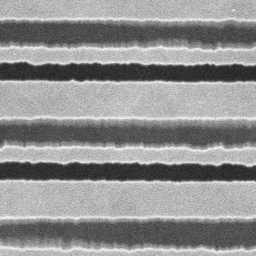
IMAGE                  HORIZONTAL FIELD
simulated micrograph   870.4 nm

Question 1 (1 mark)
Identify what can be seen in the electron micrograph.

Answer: lines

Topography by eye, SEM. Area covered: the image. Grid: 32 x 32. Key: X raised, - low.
XXXXXXXXXXXXXXXXXXXXXXXXXXXXXXXX
XXXXXXXXXXXXXXXXXXXXXXXXXXXXXXXX
---XXXXX-X-X-XXXXXXXXXXXXXXXXXXX
--------------------------------
--------------------------------
--------------------------------
XXXXXXXXXXXXXXXXXXXXXXXXXXXXXXXX
XXXXXXXXXXXXXXXXXXXXXXXXXXXXXXXX
--------------------------------
--------------------------------
XXXXXXXXXXXXXXXXXXXXXXXXXXXXXXXX
XXXXXXXXXXXXXXXXXXXXXXXXXXXXXXXX
XXXXXXXXXXXXXXXXXXXXXXXXXXXXXXXX
XXXXXXXXXXXXXXXXXXXXXXXXXXXXXXXX
XXXXXXXXXXXXXXXXXXXXXXXXXXXXXXXX
--------------------------------
--------------------------------
--------------------------------
XXXXXXXXXXXXXXXXXXXXXXXX--XX--XX
XXXXXXXXXXXXXXXXXXXXXXXXXXXXXXXX
---------------------X---XXX--XX
--------------------------------
-XX-----------------------------
XXXXXXXXXXXXXXXXXXXXXXXXXXXXXXXX
XXXXXXXXXXXXXXXXXXXXXXXXXXXXXXXX
XXXXXXXXXXXXXXXXXXXXXXXXXXXXXXXX
XXXXXXXXXXXXXXXXXXXXXXXXXXXXXXXX
--------------------------------
--------------------------------
--------------------------------
--------------------------------
XXXXXXXXXXXXXXXXXXXXXXXXXXXXXXXX